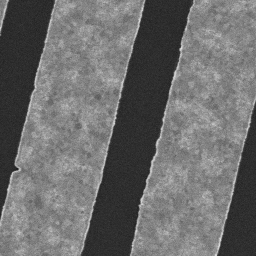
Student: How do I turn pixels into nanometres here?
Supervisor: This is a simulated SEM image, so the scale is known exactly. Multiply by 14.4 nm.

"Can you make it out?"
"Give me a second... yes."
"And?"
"one or a few lines or trenches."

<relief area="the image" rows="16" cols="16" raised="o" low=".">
...oooooo...oooo
...oooooo...oooo
...ooooo...ooooo
...ooooo...ooooo
..oooooo...ooooo
..oooooo...ooooo
..ooooo...oooooo
..ooooo...oooooo
.oooooo...ooooo.
.oooooo...ooooo.
.ooooo...oooooo.
.ooooo...oooooo.
oooooo...ooooo..
oooooo...ooooo..
ooooo...oooooo..
ooooo...oooooo..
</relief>